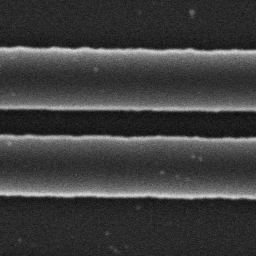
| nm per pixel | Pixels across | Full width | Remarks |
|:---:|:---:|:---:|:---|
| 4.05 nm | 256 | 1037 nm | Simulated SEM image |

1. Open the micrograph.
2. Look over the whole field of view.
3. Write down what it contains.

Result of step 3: lines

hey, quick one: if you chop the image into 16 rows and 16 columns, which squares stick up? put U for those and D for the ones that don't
DDDDDDDDDDDDDDDD
DDDDDDDDDDDDDDDD
DDDDDDDDDDDDDDDD
UUUUUUUUUUUUUUUU
UUUUUUUUUUUUUUUU
UUUUUUUUUUUUUUUU
UUUUUUUUUUUUUUUU
DDDDDDDDDDDDDDDD
UUDDDDDDDDDDDDDD
UUUUUUUUUUUUUUUU
UUUUUUUUUUUUUUUU
UUUUUUUUUUUUUUUU
DDDDDDDDDDDDDDDD
DDDDDDDDDDDDDDDD
DDDDDDDDDDDDDDDD
DDDDDDDDDDDDDDDD